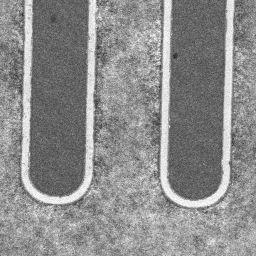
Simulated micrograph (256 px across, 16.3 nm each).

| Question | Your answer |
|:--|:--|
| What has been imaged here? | one or a few lines or trenches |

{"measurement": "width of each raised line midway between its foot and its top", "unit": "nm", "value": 1020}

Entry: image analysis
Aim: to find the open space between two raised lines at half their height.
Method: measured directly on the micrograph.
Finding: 1230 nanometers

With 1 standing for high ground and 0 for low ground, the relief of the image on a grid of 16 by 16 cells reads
0011110000011100
0011110000111100
0011110000111100
0011110000111100
0011110000111100
0011110000111100
0011110000111100
0011110000111100
0011110000111100
0011110000111100
0011110000111100
0011100000111100
0001000000011000
0000000000000000
0000000000000000
0000000000000000